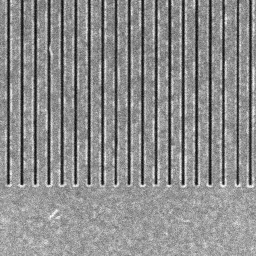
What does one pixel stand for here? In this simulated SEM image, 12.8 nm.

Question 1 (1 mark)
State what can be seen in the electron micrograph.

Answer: parallel lines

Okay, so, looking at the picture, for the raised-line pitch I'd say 173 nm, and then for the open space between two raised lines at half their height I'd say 43.3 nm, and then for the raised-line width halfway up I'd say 0.13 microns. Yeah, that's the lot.